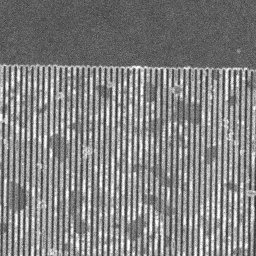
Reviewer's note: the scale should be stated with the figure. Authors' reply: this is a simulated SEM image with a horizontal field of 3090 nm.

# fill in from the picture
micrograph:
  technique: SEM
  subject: parallel lines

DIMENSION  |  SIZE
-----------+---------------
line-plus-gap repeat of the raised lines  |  67.9 nm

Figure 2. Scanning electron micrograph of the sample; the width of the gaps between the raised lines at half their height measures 0.0317 um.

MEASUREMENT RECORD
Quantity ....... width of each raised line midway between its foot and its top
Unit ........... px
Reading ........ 2.63